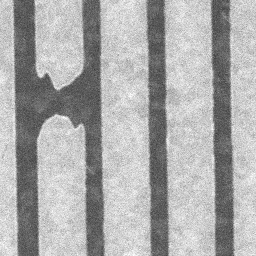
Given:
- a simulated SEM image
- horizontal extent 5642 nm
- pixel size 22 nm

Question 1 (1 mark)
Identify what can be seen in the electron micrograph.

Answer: one or a few lines or trenches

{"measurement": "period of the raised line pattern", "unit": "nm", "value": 1430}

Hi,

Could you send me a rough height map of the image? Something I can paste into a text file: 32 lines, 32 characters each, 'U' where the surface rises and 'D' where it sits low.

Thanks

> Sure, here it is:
UDDDUUUUUUDDDUUUUUDDDUUUUUDDDUUU
UDDDUUUUUUDDDUUUUUDDDUUUUUDDDUUU
UUDDDUUUUUDDDUUUUUDDDUUUUUDDDUUU
UUDDDUUUUUDDDUUUUUDDDUUUUUDDDUUU
UUDDDUUUUUDDDUUUUUDDDUUUUUDDDUUU
UUDDDUUUUUDDDUUUUUDDDUUUUUDDDUUU
UUDDDUUUUUDDDUUUUUDDDUUUUUDDDUUU
UUDDDUUUUUUDDUUUUUDDDUUUUUDDDUUU
UUDDDUUUUUDDDUUUUUDDDUUUUUDDDUUU
UUDDDDUUUUDDDUUUUUDDDUUUUUDDDUUU
UUDDDDDUDDDDDUUUUUDDDUUUUUDDDUUU
UUDDDDDDDDDDDUUUUUDDDUUUUUUDDUUU
UUDDDDDDDDDDDUUUUUDDDUUUUUDDDUUU
UUDDDDDDDDDDDUUUUUDDDUUUUUDDDUUU
UUDDDDDDDDDDDUUUUUDDDUUUUUUDDUUU
UUDDDDUUUDDDDUUUUUDDDUUUUUUDDUUU
UUDDDUUUUUDDDUUUUUDDDUUUUUUDDUUU
UUDDDUUUUUDDDUUUUUUDDUUUUUUDDUUU
UUDDDUUUUUDDDUUUUUUDDUUUUUUDDUUU
UUDDDUUUUUDDDUUUUUUDDUUUUUUDDUUU
UUDDDUUUUUUDDUUUUUUDDUUUUUUDDUUU
UUDDDUUUUUUDDUUUUUUDDUUUUUUDDUUU
UUDDDUUUUUUDDUUUUUUDDUUUUUUDDUUU
UUDDDUUUUUUDDUUUUUUDDUUUUUUDDUUU
UUDDDUUUUUUDDUUUUUUDDUUUUUUDDUUU
UUDDDUUUUUUDDUUUUUUDDUUUUUUDDUUU
UUDDDUUUUUUDDUUUUUUDDUUUUUUDDUUU
UUDDDUUUUUUDDUUUUUUDDUUUUUUDDUUU
UUDDDUUUUUUDDUUUUUUDDUUUUUUDDUUU
UUDDDUUUUUUDDUUUUUUDDUUUUUUDDUUU
UUDDDUUUUUUDDUUUUUUDDUUUUUUDDUUU
UUDDDUUUUUUDDUUUUUUDDUUUUUUDDUUU